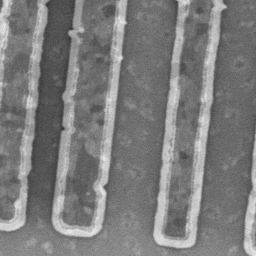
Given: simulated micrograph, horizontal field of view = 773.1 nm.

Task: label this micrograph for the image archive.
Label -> one or a few lines or trenches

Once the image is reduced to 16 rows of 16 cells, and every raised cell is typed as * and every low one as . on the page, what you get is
***..***...***..
***..***...***..
**...**....**...
**...**....**...
**...**....**...
**..***....**...
**..***....**...
**..***....**...
**..***....**...
**..***...***...
**..***...**....
*...**....**....
*...**....**....
*...**....**....
.....*....**....
................